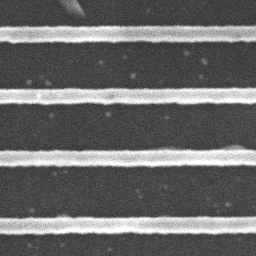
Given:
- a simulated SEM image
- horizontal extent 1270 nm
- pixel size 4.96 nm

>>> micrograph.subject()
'lines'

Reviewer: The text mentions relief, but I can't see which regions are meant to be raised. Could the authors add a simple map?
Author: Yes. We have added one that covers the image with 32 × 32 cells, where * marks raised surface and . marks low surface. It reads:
................................
................................
................................
********************************
********************************
................................
................................
................................
................................
................................
................................
********************************
********************************
................................
................................
................................
................................
................................
................................
********************************
********************************
................................
................................
................................
................................
................................
................................
********************************
********************************
................................
................................
................................